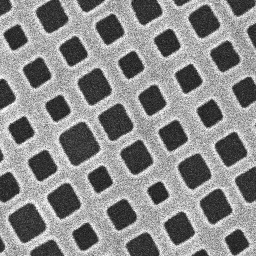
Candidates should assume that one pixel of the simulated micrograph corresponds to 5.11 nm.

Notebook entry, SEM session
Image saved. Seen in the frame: a regular array of holes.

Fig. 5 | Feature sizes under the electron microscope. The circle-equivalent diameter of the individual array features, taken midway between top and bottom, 140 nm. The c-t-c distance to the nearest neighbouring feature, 210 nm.